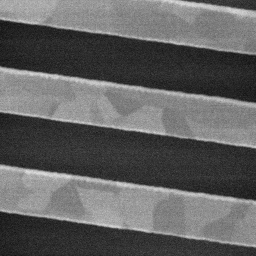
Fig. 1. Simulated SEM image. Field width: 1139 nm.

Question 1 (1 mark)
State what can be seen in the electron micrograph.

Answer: lines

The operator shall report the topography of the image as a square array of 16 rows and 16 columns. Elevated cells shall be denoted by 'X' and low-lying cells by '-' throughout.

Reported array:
XXXXXXXXXXXXXX--
--XXXXXXXXXXXXXX
---------XXXXXXX
----------------
XX--------------
XXXXXXXXX-------
XXXXXXXXXXXXXXXX
---XXXXXXXXXXXXX
-----------XXXXX
----------------
X---------------
XXXXXXXX--------
XXXXXXXXXXXXXXX-
--XXXXXXXXXXXXXX
---------XXXXXXX
----------------